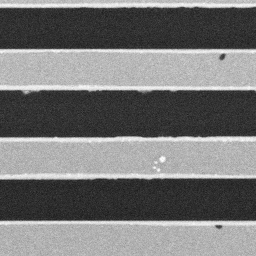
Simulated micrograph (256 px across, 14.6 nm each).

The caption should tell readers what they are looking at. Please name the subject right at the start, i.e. lines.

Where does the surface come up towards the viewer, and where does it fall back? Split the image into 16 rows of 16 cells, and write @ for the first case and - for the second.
----------------
----------------
----------------
@@@@@@@@@@@@@@@@
@@@@@@@@@@@@@@@@
@@@@@@@@@@@@@@@@
----------------
----------------
----------------
@@@@@@@@@@@@@@@@
@@@@@@@@@@@@@@@@
----------------
----------------
----------------
@@@@@@@@@@@@@@@@
@@@@@@@@@@@@@@@@